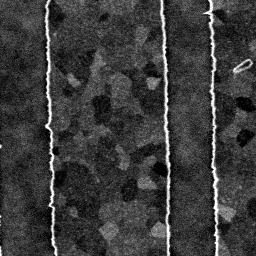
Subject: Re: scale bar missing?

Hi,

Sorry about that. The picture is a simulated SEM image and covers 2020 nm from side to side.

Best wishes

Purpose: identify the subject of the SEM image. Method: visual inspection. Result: one or a few lines or trenches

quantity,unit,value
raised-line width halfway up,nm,921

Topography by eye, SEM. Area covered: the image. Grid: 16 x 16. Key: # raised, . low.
...#######...###
...#######...###
...#######...###
...#######...###
...#######...###
...#######...###
...#######...###
...#######...###
...#######...###
...#######...###
...########..###
...########..###
...########..###
...#######...###
...########...##
...########...##